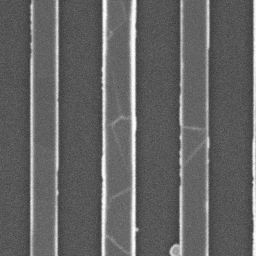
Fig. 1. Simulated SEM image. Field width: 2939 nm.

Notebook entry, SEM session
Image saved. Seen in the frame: lines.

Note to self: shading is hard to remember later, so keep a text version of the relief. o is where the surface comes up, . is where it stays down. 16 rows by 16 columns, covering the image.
..oo...o...oo...
..oo...o...oo...
..oo..oo...oo...
..oo..oo...oo...
..oo..oo...oo...
..oo..oo...oo...
..oo..oo...oo...
..oo..oo...oo...
..oo..oo...oo...
..oo..oo...oo...
..oo..oo...oo...
..oo..oo...oo...
..oo..oo...oo...
..oo..oo...oo...
..oo..oo...oo...
..oo..oo...oo...